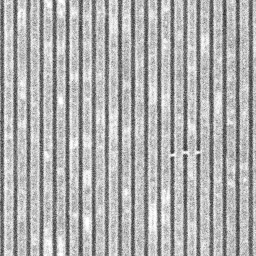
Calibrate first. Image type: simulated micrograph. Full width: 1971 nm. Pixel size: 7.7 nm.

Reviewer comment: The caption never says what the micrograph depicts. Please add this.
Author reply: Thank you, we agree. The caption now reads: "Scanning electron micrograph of parallel lines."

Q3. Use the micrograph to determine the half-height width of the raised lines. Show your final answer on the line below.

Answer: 0.0626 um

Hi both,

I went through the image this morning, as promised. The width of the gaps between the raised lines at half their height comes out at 41.4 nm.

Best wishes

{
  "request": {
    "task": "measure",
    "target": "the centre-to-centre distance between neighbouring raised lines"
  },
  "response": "101 nm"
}